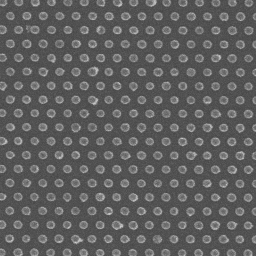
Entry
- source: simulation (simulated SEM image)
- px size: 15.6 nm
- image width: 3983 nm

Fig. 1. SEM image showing a regular array of raised bodies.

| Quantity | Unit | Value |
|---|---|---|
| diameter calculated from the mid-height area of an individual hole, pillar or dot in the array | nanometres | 131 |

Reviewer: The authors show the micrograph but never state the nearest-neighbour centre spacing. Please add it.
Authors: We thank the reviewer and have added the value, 248 nm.